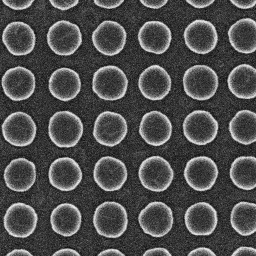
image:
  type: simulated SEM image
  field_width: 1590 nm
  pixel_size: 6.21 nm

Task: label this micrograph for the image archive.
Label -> a regular array of raised bodies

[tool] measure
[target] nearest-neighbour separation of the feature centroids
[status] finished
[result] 45 pixels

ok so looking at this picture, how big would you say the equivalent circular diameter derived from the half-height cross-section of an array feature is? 205 nm